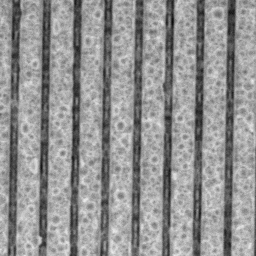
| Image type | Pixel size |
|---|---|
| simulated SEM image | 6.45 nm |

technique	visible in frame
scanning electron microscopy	parallel lines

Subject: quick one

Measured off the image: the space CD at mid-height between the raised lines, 50.8 nm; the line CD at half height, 0.147 microns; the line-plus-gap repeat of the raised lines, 198 nanometers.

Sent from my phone